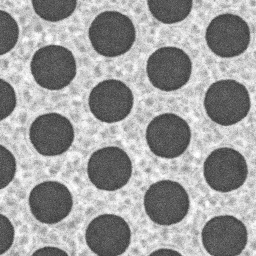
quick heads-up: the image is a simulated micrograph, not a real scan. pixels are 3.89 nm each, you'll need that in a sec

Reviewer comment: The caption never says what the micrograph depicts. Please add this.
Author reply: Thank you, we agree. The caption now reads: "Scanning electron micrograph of a regular array of holes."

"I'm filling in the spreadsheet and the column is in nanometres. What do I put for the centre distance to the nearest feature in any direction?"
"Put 259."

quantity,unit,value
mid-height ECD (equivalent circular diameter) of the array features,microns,0.182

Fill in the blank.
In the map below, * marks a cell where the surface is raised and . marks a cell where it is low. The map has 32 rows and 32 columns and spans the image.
****......********......********
.***.....****..****.....********
..***...****....***....***.....*
..*********......*********.....*
..*********......*********.....*
..****.****......*********.....*
.***.....***....***....***.....*
****......********......********
****......********......********
****.....*********......********
.****....***....***....***....**
..*********......****.****.....*
..*********......********......*
..*********......********......*
.****...****....***...****.....*
****.....*********......***...**
****.....*********......********
****.....*********......********
.***.....***...***......***..***
..***..****.....***....***....**
..*********......********......*
..*********......********......*
..****.****.....****..****.....*
.***.....***...***.....***....**
***......*********......********
***......*********......********
****.....*********......********
.****...***.....***....***....**
..*********.....*********......*
..*********.....*********......*
..*********.....*********......*
.***....***.....***...****....**